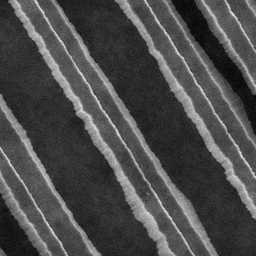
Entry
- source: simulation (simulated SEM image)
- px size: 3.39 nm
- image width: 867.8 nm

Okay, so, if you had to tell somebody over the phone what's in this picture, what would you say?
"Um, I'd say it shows lines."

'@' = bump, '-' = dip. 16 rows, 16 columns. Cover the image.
-@@@----@@@--@@@
--@@-----@@--@@@
--@@@----@@@--@@
---@@-----@@@--@
----@@----@@@--@
----@@@----@@@--
-----@@-----@@--
@----@@@----@@@-
@-----@@@----@@@
@@-----@@-----@@
@@@----@@@----@@
@@@-----@@@----@
-@@@----@@@----@
-@@@-----@@@----
--@@@-----@@----
---@@@----@@@---